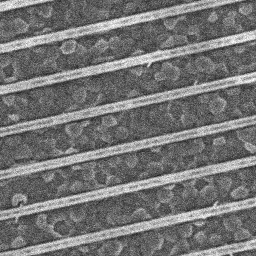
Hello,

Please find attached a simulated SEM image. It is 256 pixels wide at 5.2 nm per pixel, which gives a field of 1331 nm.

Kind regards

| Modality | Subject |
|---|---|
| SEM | parallel lines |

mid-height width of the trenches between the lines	182	nm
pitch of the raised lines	212	nanometres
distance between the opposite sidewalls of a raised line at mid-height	29.9	nm